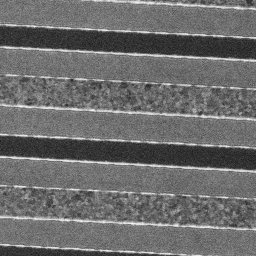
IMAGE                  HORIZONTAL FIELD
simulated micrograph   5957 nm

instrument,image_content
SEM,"lines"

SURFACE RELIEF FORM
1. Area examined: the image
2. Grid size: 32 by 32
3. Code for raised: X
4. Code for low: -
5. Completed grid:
---------------------XXXXXXXXXXX
--------------------------------
--------------------------------
XXXXXXX-------------------------
XXXXXXXXXXXXXXXXXXXXXXXXXX------
XXXXXXXXXXXXXXXXXXXXXXXXXXXXXXXX
------------XXXXXXXXXXXXXXXXXXXX
-------------------------------X
--------------------------------
XXX-----------------------------
XXXXXXXXXXXXXXXXXXXX------------
XXXXXXXXXXXXXXXXXXXXXXXXXXXXXXXX
XXXXXXXXXXXXXXXXXXXXXXXXXXXXXXXX
--------XXXXXXXXXXXXXXXXXXXXXXXX
-------------------------XXXXXXX
--------------------------------
--------------------------------
XXXXXXXXXXXXX-------------------
XXXXXXXXXXXXXXXXXXXXXXXXXXXXXXX-
XXXXXXXXXXXXXXXXXXXXXXXXXXXXXXXX
---------------XXXXXXXXXXXXXXXXX
--------------------------------
--------------------------------
XXXXXX--------------------------
XXXXXXXXXXXXXXXXXXXXXXXX--------
XXXXXXXXXXXXXXXXXXXXXXXXXXXXXXXX
XXXXXXXXXXXXXXXXXXXXXXXXXXXXXXXX
--------XXXXXXXXXXXXXXXXXXXXXXXX
---------------------------XXXXX
--------------------------------
--------------------------------
XXXXXXXXXXXXXXXXX---------------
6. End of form